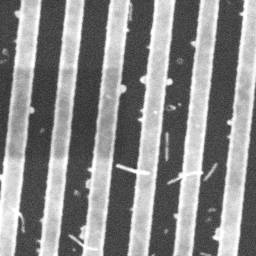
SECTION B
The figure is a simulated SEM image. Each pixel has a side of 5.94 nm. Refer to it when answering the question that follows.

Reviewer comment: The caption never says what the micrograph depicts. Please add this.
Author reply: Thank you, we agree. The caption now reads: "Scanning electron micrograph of lines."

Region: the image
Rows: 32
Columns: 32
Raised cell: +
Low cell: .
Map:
...++...++....++...+++...++....+
..+++...++....++...+++...++...++
..+++...++....++...+++...++...++
..+++...++...+++...++....++...++
..+++...++...+++...++....++...++
..+++...++...+++...++....++...++
..++....++...++....++...+++...++
..++....++...++....++...+++...++
..++...+++...++...+++...++....++
..++...++....++...+++...++....++
..++...++....++...+++...++...+++
.+++...++....++...+++...++...+++
.+++...++...+++...++....++...+++
.+++...++...+++...++....++...+++
.+++...++...+++...++....++...++.
.++....++...+++...++...+++...++.
.++....++...++....++...+++...++.
.++...+++...++....++...++....++.
.++...+++...++...+++...++....++.
.++...++....++...+++...++....++.
+++...++....++...+++...++...+++.
+++...++...+++...+++...++...+++.
+++...++...+++...++....++...+++.
+++...++...+++...++....++...++..
++....++...+++...++...+++...++..
++....++...++....++...+++...++..
++....++...++....++...+++...++..
++...+++...++...+++...++....++..
++...++....++...+++...++....++..
++...++....++...+++...++...+++..
++...++...+++...+++...++...+++..
++...++...+++...++....++...+++..